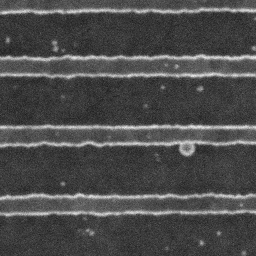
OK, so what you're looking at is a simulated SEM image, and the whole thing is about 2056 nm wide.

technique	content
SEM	lines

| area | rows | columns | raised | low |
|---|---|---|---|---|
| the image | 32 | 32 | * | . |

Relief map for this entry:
********************************
**********.......*..****........
................................
................................
................................
................................
................................
********************************
********************************
......***..*.****.*...****...*..
................................
................................
................................
................................
................................
................................
********************************
********************************
................................
................................
................................
................................
................................
................................
...************..***************
********************************
********************************
................................
................................
................................
................................
................................